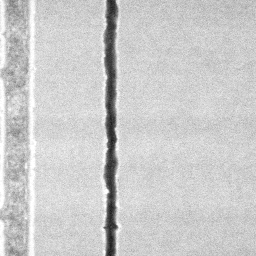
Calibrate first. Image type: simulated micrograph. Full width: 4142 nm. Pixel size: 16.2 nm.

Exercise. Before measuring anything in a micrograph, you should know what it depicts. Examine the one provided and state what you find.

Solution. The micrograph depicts one or a few lines or trenches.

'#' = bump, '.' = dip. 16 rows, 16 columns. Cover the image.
..##############
..##############
..##############
..##############
..##############
..##############
..##############
..##############
..##############
..##############
..##############
..##############
..##############
..##############
..##############
..##############